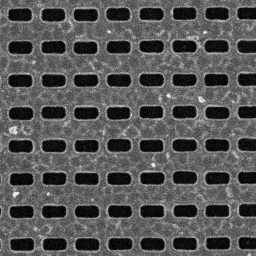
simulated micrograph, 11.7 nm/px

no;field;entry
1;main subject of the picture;a regular array of holes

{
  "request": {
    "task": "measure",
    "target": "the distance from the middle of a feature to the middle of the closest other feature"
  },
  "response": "379 nm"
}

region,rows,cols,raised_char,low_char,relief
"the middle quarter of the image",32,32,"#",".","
################################
################################
###.....####....###.....####....
.#.......##......##......##.....
##.......##......##......##.....
###.....###.....####....####....
################################
################################
################################
################################
####################....####....
###......##......##......##.....
.#.......##......##......##.....
###.....###.....####....####....
################################
################################
################################
################################
################################
###......##......##......##.....
.#.......##......##......##.....
###.....###......##......##.....
################################
################################
################################
################################
################################
###.....###......##......##.....
.#.......##......##......##.....
.##......##......##......##.....
################################
################################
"